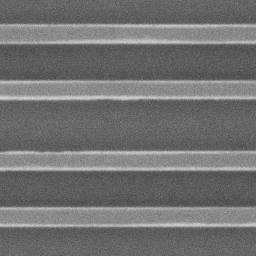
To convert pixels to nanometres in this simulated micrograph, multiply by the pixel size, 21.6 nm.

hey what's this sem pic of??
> lines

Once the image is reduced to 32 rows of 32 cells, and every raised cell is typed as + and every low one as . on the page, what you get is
................................
................................
................................
++++++++++++++++++++++++++++++++
++++++++++++++++++++++++++++++++
................................
................................
................................
................................
................................
++++++++++++++++++++++++++++++++
++++++++++++++++++++++++++++++++
................................
................................
................................
................................
................................
................................
................................
++++++++++++++++++++++++++++++++
++++++++++++++++++++++++++++++++
................................
................................
................................
................................
................................
++++++++++++++++++++++++++++++++
++++++++++++++++++++++++++++++++
................................
................................
................................
................................